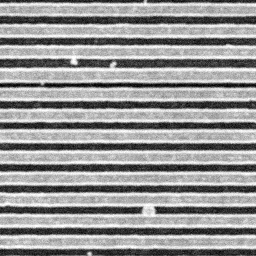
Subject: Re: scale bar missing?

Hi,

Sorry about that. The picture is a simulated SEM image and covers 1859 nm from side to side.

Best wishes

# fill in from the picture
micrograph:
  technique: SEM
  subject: parallel lines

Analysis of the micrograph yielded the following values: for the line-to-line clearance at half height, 9.75 pixels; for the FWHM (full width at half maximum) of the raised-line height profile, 11.5 px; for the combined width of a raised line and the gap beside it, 0.153 µm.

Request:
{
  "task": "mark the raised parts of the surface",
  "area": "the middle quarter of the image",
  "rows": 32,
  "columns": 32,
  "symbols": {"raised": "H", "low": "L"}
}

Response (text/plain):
LLLLLLLLLLLLLLLLLLLLLLLLLLLLLLLL
HHHHHHHHHHHHHHHHHHHHHHHHHHHHHHHH
HHHHHHHHHHHHHHHHHHHHHHHHHHHHHHHH
HHHHHHHHHHHHHHHHHHHHHHHHHHHHHHHH
LLLLLLLLLLLLLLLLLLLLLLLLLLLLLLLL
LLLLLLLLLLLLLLLLLLLLLLLLLLLLLLLL
HHHHHHHHHHHHHHHHHHHHHHHHHHHHHHHH
HHHHHHHHHHHHHHHHHHHHHHHHHHHHHHHH
HHHHHHHHHHHHHHHHHHHHHHHHHHHHHHHH
LLLLLLLLLLLLLLLLLLLLLLLLLLLLLLLL
LLLLLLLLLLLLLLLLLLLLLLLLLLLLLLLL
LLLLLLLLLLLLLLLLLLLLLLLLLLLLLLLL
HHHHHHHHHHHHHHHHHHHHHHHHHHHHHHHH
HHHHHHHHHHHHHHHHHHHHHHHHHHHHHHHH
LLLLLLLLLLLLLLLLLLLLLLLLLLLLLLLL
LLLLLLLLLLLLLLLLLLLLLLLLLLLLLLLL
LLLLLLLLLLLLLLLLLLLLLLLLLLLLLLLL
HHHHHHHHHHHHHHHHHHHHHHHHHHHHHHHH
HHHHHHHHHHHHHHHHHHHHHHHHHHHHHHHH
LLLLLLLLLLLLLLLLLLLLLLLLLLHHHHLH
LLLLLLLLLLLLLLLLLLLLLLLLLLLLLLLL
LLLLLLLLLLLLLLLLLLLLLLLLLLLLLLLL
HHHHHHHHHHHHHHHHHHHHHHHHHHHHHHHH
HHHHHHHHHHHHHHHHHHHHHHHHHHHHHHHH
HHHHHHHHHHHHHHHHHHHHHHHHHHHHHHHH
LLLLLLLLLLLLLLLLLLLLLLLLLLLLLLLL
LLLLLLLLLLLLLLLLLLLLLLLLLLLLLLLL
HHHHHHHHHHHHHHHHHHHHHHHHHHHHHHHH
HHHHHHHHHHHHHHHHHHHHHHHHHHHHHHHH
HHHHHHHHHHHHHHHHHHHHHHHHHHHHHHHH
LLLLLLLLLLLLLLLLLLLLLLLLLLLLLLLL
LLLLLLLLLLLLLLLLLLLLLLLLLLLLLLLL